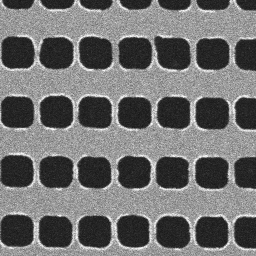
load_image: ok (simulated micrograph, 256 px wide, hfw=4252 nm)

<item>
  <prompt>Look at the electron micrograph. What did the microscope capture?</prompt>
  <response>a regular array of holes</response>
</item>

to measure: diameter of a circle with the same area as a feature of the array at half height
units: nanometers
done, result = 589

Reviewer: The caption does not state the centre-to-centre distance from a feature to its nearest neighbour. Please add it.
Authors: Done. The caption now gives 641 nanometers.